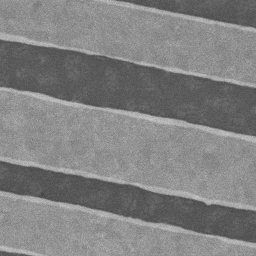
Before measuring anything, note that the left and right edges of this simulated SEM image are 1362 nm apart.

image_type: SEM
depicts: one or a few lines or trenches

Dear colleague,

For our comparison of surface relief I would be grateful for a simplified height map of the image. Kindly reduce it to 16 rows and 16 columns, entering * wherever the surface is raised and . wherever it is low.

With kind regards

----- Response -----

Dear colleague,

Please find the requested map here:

*********.......
**************..
.***************
.......*********
...........*****
................
*****...........
**********......
***************.
****************
...*************
........********
**...........***
*******.........
************....
****************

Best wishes